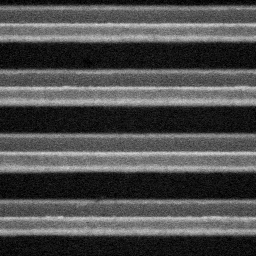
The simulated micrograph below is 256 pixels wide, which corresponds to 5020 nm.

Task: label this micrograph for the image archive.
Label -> lines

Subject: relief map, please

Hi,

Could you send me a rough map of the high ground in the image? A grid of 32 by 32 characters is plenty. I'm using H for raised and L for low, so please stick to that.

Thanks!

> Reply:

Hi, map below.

LLLLLLLLLLLLLLLLLLLLLLLLLLLLLLLL
HHHHHHHHHHHHHHHHHHHHHHHHHHHHHHHH
HHHHHHHHHHHHHHHHHHHHHHHHHHHHHHHH
HHHHHHHHHHHHHHHHHHHHHHHHHHHHHHHH
HHHHHHHHHHHHHHHHHHHHHHHHHHHHHHHH
LLLLLLLLLLLLLLLLLLLLLLLLLLLLLLLL
LLLLLLLLLLLLLLLLLLLLLLLLLLLLLLLL
LLLLLLLLLLLLLLLLLLLLLLLLLLLLLLLL
LLLLLLLLLLLLLLLLLLLLLLLLLLLLLLLL
HHHHHHHHHHHHHHHHHHHHHHHHHHHHHHHH
HHHHHHHHHHHHHHHHHHHHHHHHHHHHHHHH
HHHHHHHHHHHHHHHHHHHHHHHHHHHHHHHH
HHHHHHHHHHHHHHHHHHHHHHHHHHHHHHHH
LLLLLLLLLLLLLLLLLLLLLLLLLLLLLLLL
LLLLLLLLLLLLLLLLLLLLLLLLLLLLLLLL
LLLLLLLLLLLLLLLLLLLLLLLLLLLLLLLL
LLLLLLLLLLLLLLLLLLLLLLLLLLLLLLLL
HHHHHHHHHHHHHHHHHHHHHHHHHHHHHHHH
HHHHHHHHHHHHHHHHHHHHHHHHHHHHHHHH
HHHHHHHHHHHHHHHHHHHHHHHHHHHHHHHH
HHHHHHHHHHHHHHHHHHHHHHHHHHHHHHHH
LLLLLLLLLLLLLLLLLLLLLLLLLLLLLLLL
LLLLLLLLLLLLLLLLLLLLLLLLLLLLLLLL
LLLLLLLLLLLLLLLLLLLLLLLLLLLLLLLL
LLLLLLLLLLLLLLLLLLLLLLLLLLLLLLLL
HHHHHHHHHHHHHHHHHHHHHHHHHHHHHHHH
HHHHHHHHHHHHHHHHHHHHHHHHHHHHHHHH
HHHHHHHHHHHHHHHHHHHHHHHHHHHHHHHH
HHHHHHHHHHHHHHHHHHHHHHHHHHHHHHHH
LLLLLLLLLLLLLLLLLLLLLLLLLLLLLLLL
LLLLLLLLLLLLLLLLLLLLLLLLLLLLLLLL
LLLLLLLLLLLLLLLLLLLLLLLLLLLLLLLL